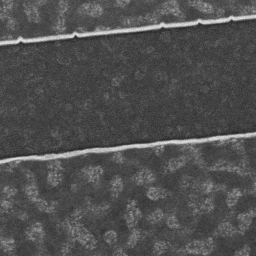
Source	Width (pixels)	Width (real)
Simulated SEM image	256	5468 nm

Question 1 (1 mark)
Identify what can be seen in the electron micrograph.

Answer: one or a few lines or trenches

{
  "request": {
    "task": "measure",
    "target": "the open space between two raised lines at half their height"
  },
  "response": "2490 nm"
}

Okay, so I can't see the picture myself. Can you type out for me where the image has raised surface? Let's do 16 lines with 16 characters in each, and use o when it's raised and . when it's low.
oooooooooooooooo
oooooooooooo....
oo..............
................
................
................
................
................
...............o
.....ooooooooooo
oooooooooooooooo
oooooooooooooooo
oooooooooooooooo
oooooooooooooooo
oooooooooooooooo
oooooooooooooooo